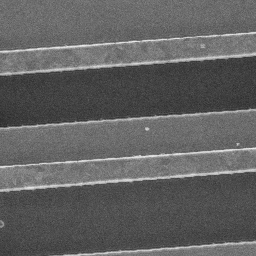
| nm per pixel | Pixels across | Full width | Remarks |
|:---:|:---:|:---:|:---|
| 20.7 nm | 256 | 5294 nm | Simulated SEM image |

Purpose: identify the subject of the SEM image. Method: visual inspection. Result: lines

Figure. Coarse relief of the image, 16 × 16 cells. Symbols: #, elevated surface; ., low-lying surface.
################
################
################
###############.
##..............
................
................
........########
################
################
################
######..........
................
................
................
...........#####